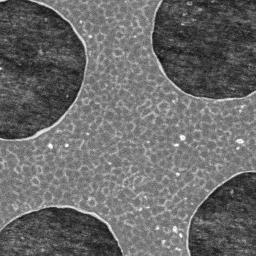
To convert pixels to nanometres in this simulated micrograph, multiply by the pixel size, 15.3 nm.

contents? holes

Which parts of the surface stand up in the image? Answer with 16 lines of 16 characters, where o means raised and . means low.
...ooooooo......
....oooooo......
.....ooooo......
.....ooooo......
.....ooooo......
.....oooooo.....
.....ooooooooooo
....oooooooooooo
..oooooooooooooo
oooooooooooooooo
oooooooooooooooo
oooooooooooooo..
ooooooooooooo...
o.....oooooo....
.......ooooo....
........oooo....